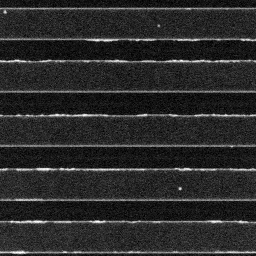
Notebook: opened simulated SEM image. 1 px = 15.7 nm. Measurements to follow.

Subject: lines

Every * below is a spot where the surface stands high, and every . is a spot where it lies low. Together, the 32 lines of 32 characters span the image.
................................
********************************
********************************
********************************
********************************
................................
................................
................................
********************************
********************************
********************************
................................
................................
................................
..*..*********...******.******.*
********************************
********************************
********************************
................................
................................
................................
********************************
********************************
********************************
********************************
................................
................................
................................
********************************
********************************
********************************
********************************